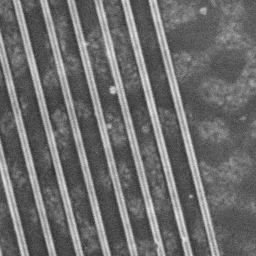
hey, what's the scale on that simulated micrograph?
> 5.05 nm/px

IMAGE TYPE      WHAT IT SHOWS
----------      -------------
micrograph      parallel lines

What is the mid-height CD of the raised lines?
28.8 nm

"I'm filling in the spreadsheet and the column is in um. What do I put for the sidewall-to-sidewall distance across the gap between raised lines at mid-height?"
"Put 0.105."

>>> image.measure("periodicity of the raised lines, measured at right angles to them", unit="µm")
0.133